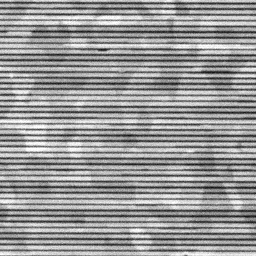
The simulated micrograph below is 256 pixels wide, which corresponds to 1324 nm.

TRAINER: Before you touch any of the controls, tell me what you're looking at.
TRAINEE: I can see parallel lines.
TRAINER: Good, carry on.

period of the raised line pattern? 5.76 pixels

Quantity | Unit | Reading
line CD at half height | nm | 16.1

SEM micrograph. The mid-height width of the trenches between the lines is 12.9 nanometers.